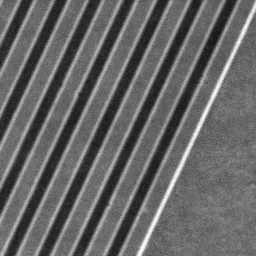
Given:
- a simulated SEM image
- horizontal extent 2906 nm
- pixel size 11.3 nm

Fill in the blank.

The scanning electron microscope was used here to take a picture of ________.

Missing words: parallel lines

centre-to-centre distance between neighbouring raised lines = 350 nm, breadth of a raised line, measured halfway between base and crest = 206 nm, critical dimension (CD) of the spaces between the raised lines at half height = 144 nanometers